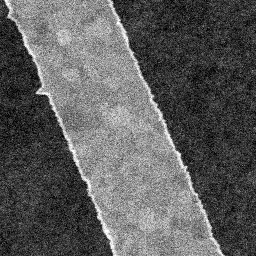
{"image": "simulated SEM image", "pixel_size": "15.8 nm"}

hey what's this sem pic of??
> one or a few lines or trenches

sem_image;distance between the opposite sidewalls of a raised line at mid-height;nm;1500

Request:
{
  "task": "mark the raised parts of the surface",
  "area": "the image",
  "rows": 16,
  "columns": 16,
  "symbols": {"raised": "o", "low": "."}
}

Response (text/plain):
.oooooo.........
.ooooooo........
..oooooo........
..oooooo........
..ooooooo.......
...oooooo.......
...ooooooo......
....oooooo......
....ooooooo.....
.....oooooo.....
.....oooooo.....
.....ooooooo....
......oooooo....
......ooooooo...
.......oooooo...
.......ooooooo..